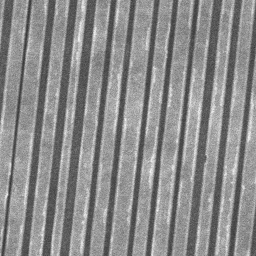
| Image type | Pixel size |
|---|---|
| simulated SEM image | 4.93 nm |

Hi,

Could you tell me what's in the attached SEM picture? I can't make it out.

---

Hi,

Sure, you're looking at parallel lines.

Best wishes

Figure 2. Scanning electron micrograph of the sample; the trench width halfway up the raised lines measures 38.6 nanometres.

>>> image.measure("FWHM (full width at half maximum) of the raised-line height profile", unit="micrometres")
0.0625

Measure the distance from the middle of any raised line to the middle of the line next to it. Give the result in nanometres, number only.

102